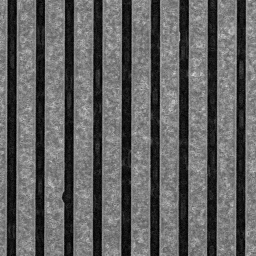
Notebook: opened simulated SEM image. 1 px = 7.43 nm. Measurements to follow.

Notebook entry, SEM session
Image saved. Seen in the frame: parallel lines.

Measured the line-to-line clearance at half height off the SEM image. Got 70.6 nm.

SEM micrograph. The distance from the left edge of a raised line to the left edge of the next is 213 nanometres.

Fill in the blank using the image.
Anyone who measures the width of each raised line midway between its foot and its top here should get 141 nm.